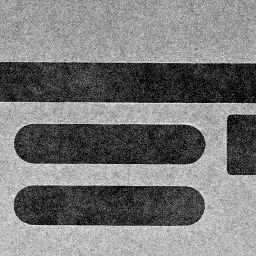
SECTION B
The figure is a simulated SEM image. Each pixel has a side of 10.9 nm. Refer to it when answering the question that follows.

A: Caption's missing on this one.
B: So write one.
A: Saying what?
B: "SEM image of groups of lines, slits or small figures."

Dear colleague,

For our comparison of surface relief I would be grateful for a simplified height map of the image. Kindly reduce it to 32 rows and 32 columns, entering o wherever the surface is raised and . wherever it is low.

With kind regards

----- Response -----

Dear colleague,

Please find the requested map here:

oooooooooooooooooooooooooooooooo
oooooooooooooooooooooooooooooooo
oooooooooooooooooooooooooooooooo
oooooooooooooooooooooooooooooooo
oooooooooooooooooooooooooooooooo
oooooooooooooooooooooooooooooooo
oooooooooooooooooooooooooooooooo
oooooooooooooooooooooooooooooooo
................................
................................
................................
................................
................................
oooooooooooooooooooooooooooooooo
ooooooooooooooooooooooooooooo...
oooo...................ooooo....
oo.......................ooo....
oo........................oo....
oo........................oo....
oo.......................ooo....
oooo....................oooo....
oooooooooooooooooooooooooooo....
oooooooooooooooooooooooooooooooo
ooo.....................oooooooo
oo.......................ooooooo
oo........................oooooo
oo........................oooooo
oo.......................ooooooo
oooooooooooooooooooooooooooooooo
oooooooooooooooooooooooooooooooo
oooooooooooooooooooooooooooooooo
oooooooooooooooooooooooooooooooo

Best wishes